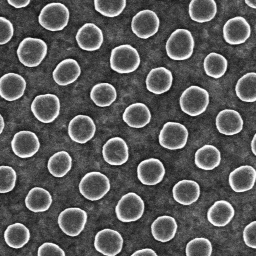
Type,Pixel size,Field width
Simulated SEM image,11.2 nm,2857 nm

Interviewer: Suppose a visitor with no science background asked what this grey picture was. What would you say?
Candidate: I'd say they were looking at a regular array of raised bodies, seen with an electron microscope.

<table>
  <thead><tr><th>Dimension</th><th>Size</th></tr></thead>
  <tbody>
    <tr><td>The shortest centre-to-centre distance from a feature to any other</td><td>451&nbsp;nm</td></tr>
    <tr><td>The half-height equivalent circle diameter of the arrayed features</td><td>291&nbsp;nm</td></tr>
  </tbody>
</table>